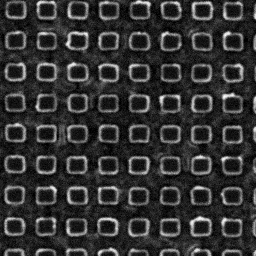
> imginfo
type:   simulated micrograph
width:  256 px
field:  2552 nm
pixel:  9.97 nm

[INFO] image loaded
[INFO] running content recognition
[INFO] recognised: a regular array of raised bodies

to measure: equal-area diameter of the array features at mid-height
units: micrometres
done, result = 0.199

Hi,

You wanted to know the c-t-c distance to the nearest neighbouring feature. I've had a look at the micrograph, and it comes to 304 nm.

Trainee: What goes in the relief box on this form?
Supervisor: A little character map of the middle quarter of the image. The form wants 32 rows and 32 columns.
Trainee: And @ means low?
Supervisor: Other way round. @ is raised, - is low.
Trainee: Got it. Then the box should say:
-@@@@@---@@@@----@@@@----@@@@---
-@@@@@---@@@@----@@@@---@@@@@---
-@@@@@---@@@@----@@@@---@@@@@---
-@@@@@---@@@@----@@@@---@@@@@---
--------------------------------
--------------------------------
--------------------------------
--------------------------------
-@@@@@---@@@@----@@@@---@@@@@---
-@@@@@---@@@@---@@@@@---@@@@@---
-@@@@@---@@@@---@@@@@---@@@@@---
--@@@@---@@@@----@@@@---@@@@@---
--------------------------------
--------------------------------
--------------------------------
--@@@----@@@@-----@@------------
-@@@@@---@@@@----@@@@---@@@@@---
-@@@@@---@@@@----@@@@---@@@@@---
-@@@@@---@@@@----@@@@---@@@@@---
--@@@-------@--------------@@---
--------------------------------
--------------------------------
--------------------------------
-@@@@----@@@@----@@@@----@@@----
-@@@@@---@@@@---@@@@@---@@@@@---
-@@@@@---@@@@@--@@@@@---@@@@@---
-@@@@@---@@@@@--@@@@@---@@@@@---
----------@@-----@--------------
--------------------------------
--------------------------------
--------------------------------
-@@@@@---@@@@----@@@@---@@@@@---